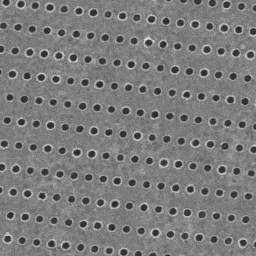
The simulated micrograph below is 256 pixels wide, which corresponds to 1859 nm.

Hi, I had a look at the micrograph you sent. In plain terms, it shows a regular array of holes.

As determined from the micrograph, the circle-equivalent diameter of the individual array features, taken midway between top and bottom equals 52.4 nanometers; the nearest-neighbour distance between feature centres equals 105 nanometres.